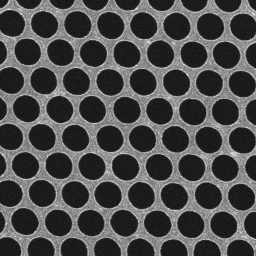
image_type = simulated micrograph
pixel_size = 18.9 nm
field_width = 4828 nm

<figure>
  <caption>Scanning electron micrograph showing a regular array of holes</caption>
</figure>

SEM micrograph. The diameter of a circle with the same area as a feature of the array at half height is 508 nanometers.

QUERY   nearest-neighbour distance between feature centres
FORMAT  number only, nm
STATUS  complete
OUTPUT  610